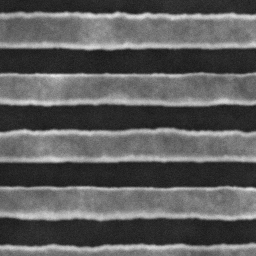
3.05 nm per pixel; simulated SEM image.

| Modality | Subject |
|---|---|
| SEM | lines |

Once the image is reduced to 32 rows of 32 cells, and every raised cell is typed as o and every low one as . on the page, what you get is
................................
................................
oooooooooooooooooooooooooooooooo
oooooooooooooooooooooooooooooooo
oooooooooooooooooooooooooooooooo
oooooooooooooooooooooooooooooooo
................................
................................
................................
oooooooooooooooooooooooooooooooo
oooooooooooooooooooooooooooooooo
oooooooooooooooooooooooooooooooo
oooooooooooooooooooooooooooooooo
................................
................................
................................
.ooooooooooooooooooooooooooooo.o
oooooooooooooooooooooooooooooooo
oooooooooooooooooooooooooooooooo
oooooooooooooooooooooooooooooooo
................................
................................
................................
oooooooooooooooooooo.ooooooooooo
oooooooooooooooooooooooooooooooo
oooooooooooooooooooooooooooooooo
oooooooooooooooooooooooooooooooo
............o..............ooo..
................................
................................
................................
oooooooooooooooooooooooooooooooo